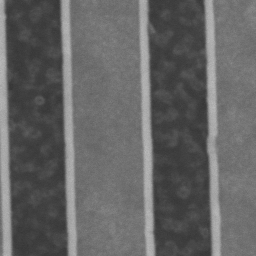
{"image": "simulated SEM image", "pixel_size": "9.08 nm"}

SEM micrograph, one or a few lines or trenches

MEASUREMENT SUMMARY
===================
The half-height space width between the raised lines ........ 597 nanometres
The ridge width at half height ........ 704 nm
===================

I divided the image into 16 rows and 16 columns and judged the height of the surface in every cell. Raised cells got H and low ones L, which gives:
LLLLHHHHHLLLLHHH
LLLLHHHHHLLLLHHH
LLLLHHHHHLLLLHHH
LLLLHHHHHLLLLHHH
LLLLHHHHHLLLLHHH
LLLLHHHHHLLLLHHH
LLLLHHHHHLLLLHHH
LLLLHHHHHLLLLHHH
LLLLHHHHHLLLLHHH
LLLLHHHHHLLLLHHH
LLLLHHHHHLLLLHHH
LLLLHHHHHLLLLHHH
LLLLHHHHHLLLLHHH
LLLLHHHHHLLLLHHH
LLLLLHHHHLLLLLHH
LLLLLHHHHLLLLLHH